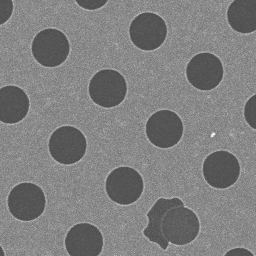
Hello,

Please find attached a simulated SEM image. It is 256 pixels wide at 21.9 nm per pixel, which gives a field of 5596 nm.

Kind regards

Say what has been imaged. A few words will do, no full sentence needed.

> a regular array of holes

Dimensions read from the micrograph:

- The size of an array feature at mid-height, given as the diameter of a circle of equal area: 836 nm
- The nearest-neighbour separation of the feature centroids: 1520 nm